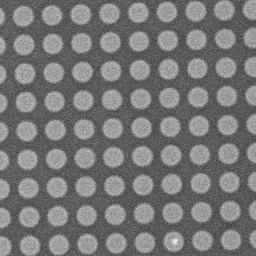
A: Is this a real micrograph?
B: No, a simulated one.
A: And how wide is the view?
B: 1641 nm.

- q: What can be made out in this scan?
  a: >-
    an array of small figures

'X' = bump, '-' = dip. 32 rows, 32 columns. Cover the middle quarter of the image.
---XXXX---XXXX---XXXX---XXXX---X
--XXXXX--XXXXX---XXXX---XXXX---X
--XXXXX--XXXXX---XXXX---XXXX---X
---XXXX---XXXX----XX-----XX-----
--------------------------------
--------------------------------
------------------XX-----XXX----
---XXXX---XXXX---XXXX---XXXXX--X
--XXXXX---XXXX---XXXXX--XXXXX--X
--XXXXX---XXXX---XXXX---XXXXX--X
---XXXX---XXXX---XXXX----XXX----
--------------------------------
--------------------------------
-------------------X------XX----
---XXXX---XXXX---XXXX---XXXXX--X
---XXXX---XXXX---XXXXX--XXXXX--X
---XXXX---XXXXX--XXXXX--XXXXX--X
---XXXX---XXXX----XXX----XXX----
----XX--------------------------
--------------------------------
--------------------------X-----
----XXX----XXX----XXXX---XXXX---
---XXXXX--XXXXX--XXXXX--XXXXX---
---XXXXX--XXXXX--XXXXX--XXXXX---
---XXXXX--XXXXX---XXXX---XXXX---
----XXX----XX-------------------
--------------------------------
--------------------------------
----XXX----XXX----XXX----XXXX---
---XXXXX--XXXXX--XXXXX---XXXX---
X--XXXXX--XXXXX--XXXXX---XXXX---
X--XXXXX--XXXXX---XXXX---XXXX---